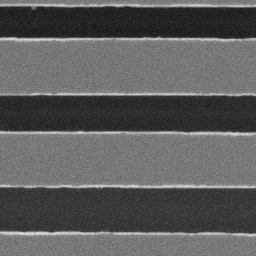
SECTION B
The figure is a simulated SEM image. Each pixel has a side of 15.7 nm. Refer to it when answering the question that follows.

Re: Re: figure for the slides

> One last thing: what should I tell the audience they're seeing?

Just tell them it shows lines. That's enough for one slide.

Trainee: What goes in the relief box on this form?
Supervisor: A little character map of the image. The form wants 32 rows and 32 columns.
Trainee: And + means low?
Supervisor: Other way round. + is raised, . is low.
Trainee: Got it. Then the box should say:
++++++++++++++++++++++++++++++++
................................
................................
................................
................................
++++++++++++++++++++++++++++++++
++++++++++++++++++++++++++++++++
++++++++++++++++++++++++++++++++
++++++++++++++++++++++++++++++++
++++++++++++++++++++++++++++++++
++++++++++++++++++++++++++++++++
++++++++++++++++++++++++++++++++
................................
................................
................................
................................
................................
++++++++++++++++++++++++++++++++
++++++++++++++++++++++++++++++++
++++++++++++++++++++++++++++++++
++++++++++++++++++++++++++++++++
++++++++++++++++++++++++++++++++
++++++++++++++++++++++++++++++++
................................
................................
................................
................................
................................
................................
++++++++++++++++++++++++++++++++
++++++++++++++++++++++++++++++++
++++++++++++++++++++++++++++++++